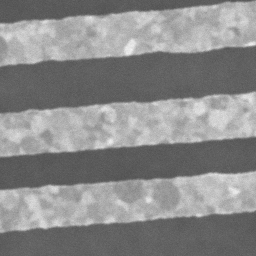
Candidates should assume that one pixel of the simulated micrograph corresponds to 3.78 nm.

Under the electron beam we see lines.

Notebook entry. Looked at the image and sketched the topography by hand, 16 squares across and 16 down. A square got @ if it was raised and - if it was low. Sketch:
------------@@@@
@@@@@@@@@@@@@@@@
@@@@@@@@@@@@@@@@
@@@@@@@@--------
----------------
----------------
-------@@@@@@@@@
@@@@@@@@@@@@@@@@
@@@@@@@@@@@@@@@@
@@@-------------
----------------
------@@@@@@@@@@
@@@@@@@@@@@@@@@@
@@@@@@@@@@@@@---
----------------
----------------